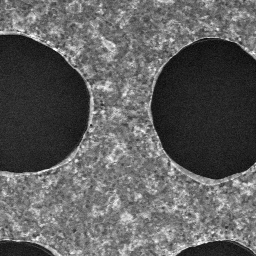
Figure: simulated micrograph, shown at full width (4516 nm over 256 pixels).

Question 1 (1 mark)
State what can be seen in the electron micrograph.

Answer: holes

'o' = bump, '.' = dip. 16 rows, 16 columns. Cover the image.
oooooooooooooooo
oooooooooooooooo
..oooooooooo..oo
....ooooooo.....
.....ooooo......
......oooo......
......ooo.......
......oooo......
.....ooooo......
.....ooooo......
...oooooooo.....
oooooooooooooooo
oooooooooooooooo
oooooooooooooooo
oooooooooooooooo
...ooooooooo...o